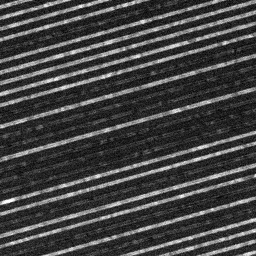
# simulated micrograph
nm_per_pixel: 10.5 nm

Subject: parallel lines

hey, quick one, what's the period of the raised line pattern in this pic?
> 110 nm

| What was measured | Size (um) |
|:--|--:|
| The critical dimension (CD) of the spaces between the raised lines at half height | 0.0847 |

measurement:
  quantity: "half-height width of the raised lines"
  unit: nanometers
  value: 25.2